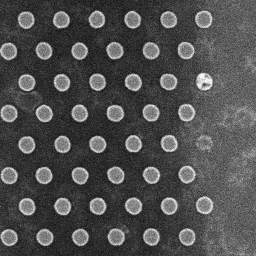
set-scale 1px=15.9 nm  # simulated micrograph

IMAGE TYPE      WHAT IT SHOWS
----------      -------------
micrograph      a regular array of raised bodies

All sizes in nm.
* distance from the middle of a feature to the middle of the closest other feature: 561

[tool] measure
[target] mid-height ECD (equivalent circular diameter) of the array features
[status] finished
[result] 259 nm